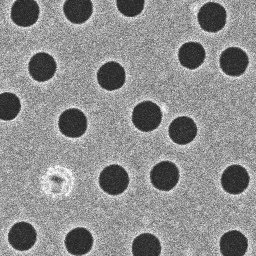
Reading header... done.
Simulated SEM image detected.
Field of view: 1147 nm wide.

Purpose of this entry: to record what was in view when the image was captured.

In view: a regular array of holes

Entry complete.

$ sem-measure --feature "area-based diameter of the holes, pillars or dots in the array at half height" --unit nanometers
129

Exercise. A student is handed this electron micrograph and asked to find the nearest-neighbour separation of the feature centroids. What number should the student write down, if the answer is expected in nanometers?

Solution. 224